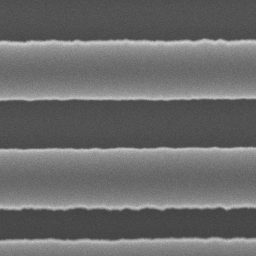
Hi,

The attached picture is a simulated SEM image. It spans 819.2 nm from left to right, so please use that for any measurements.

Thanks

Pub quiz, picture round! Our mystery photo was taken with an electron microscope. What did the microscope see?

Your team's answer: lines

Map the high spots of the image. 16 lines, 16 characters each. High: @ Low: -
----------------
----------------
----------------
@@@@@@@@@@@@@@@@
@@@@@@@@@@@@@@@@
@@@@@@@@@@@@@@@@
----------------
----------------
----------------
@@@@@@@@@@@@@@@@
@@@@@@@@@@@@@@@@
@@@@@@@@@@@@@@@@
@@@@@@@@@@@@@@@@
----------------
----------------
@@@@@@@@@@@@@@@@